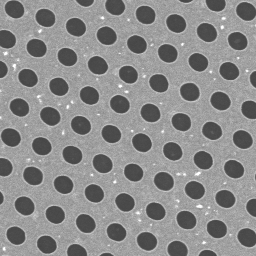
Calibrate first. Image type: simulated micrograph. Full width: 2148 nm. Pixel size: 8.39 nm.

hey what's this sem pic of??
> a regular array of holes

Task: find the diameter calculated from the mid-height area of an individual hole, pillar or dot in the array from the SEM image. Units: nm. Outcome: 159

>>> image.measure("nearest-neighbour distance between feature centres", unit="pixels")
31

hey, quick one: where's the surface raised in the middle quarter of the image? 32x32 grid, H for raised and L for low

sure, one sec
HLHHHHLLLLLHHHHLHHHHHHHHHHHHHHHL
HHHHHHLLLLLHHHLLLLHHHHHHHHHHHHHH
HHHHHHHHLLHHHHLLLLHHHHHHHHHHHHHH
HHHHHHHHHHHHHHLLLLHHHHLLLLHHHHHH
LHHHHHHHHHHHHHHLLLHHHLLLLLHHHHHH
LHHHHHHHHHHHHHHHHHHHHLLLLLHHHLLL
LHHHLLLLHHHHHHHHHHHHHHLLLLHHHLLL
HHHHLLLLLHHHHHHHHHHHHHHHHHHHHLLL
HHHHLLLLLHHHLLLHHHHHHHHHHHHHHHLL
HHHHHLLLHHHLLLLLHHHHHHHHHHHHHHHH
HHHHHHHHHHHHLLLLHHHHLLLHHHHHHHHH
HHHHHHHHHHHHLLLLHHHLLLLLHHHHHHHH
HHHHHHHHHHHHHHHHHHHLLLLLHHHHLLHH
HHLLLHHHHHHHHHHHHHHHLLLLHHHLLLLH
HHLLLLHHHHHHHHHHHHHHHLHHHHHLLLLL
HHLLLLLHHHLLLHHHHHHHHHHHHHHLLLLL
HHLLLLLHHHLLLLHHHHHHHHHHHHHHLLLH
HHHHLHHHHLLLLLHHHHLLHHHHHHHHHHHH
HHHHHHHHHHLLLLHHHLLLLHHHHHHHHHHH
HHHHHHHHHHHLLHHHHLLLLLHHHHHHHHHH
HHHHHHHHHHHHHHHHHLLLLLHHHLLLLHHH
LLLLHHHHHHHHHHHHHHLLLHHHHLLLLHHH
LLLLLHHHHHHHHHHHHHHHHHHHHLLLLLHH
LLLLLHHLLLLHHHHHHHHHHHHHHHLLLHHH
HLLLHHHLLLLLHHHHHHHHHHHHHHHHHHHH
HHHHHHHLLLLLHHHHLLLHHHHHHHHHHHHH
HHHHHHHHLLLLHHHLLLLLHHHHHHHHHHHH
HHHHHHHHHHHHHHHLLLLLHHHLLLHHHHHH
LHHHHHHHHHHHHHHHLLLHHHHLLLLHHHHH
LLHHHHHHHHHHHHHHHHHHHHLLLLLHHHHL
LLHHHHLLLHHHHHHHHHHHHHHLLLLHHHLL
LLHHHLLLLLHHHHHHHHHHHHHHLLHHHHLL